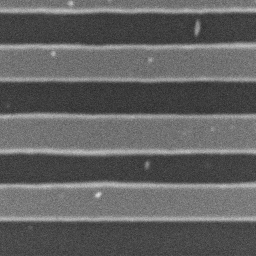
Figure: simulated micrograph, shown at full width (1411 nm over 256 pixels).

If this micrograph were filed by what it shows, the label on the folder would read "lines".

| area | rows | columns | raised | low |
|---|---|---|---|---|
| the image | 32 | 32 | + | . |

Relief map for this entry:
++++++++++++++++++++++++++++++++
................................
................................
................................
................................
................................
++++++++++++++++++++++++++++++++
++++++++++++++++++++++++++++++++
++++++++++++++++++++++++++++++++
++++++++++++++++++++++++++++++++
................................
................................
................................
................................
++++++++++++++++++++++++++++++++
++++++++++++++++++++++++++++++++
++++++++++++++++++++++++++++++++
++++++++++++++++++++++++++++++++
++++++++++++++++++++++++++++++++
................................
................................
................................
................................
++++++++++++++++++++++++++++++++
++++++++++++++++++++++++++++++++
++++++++++++++++++++++++++++++++
++++++++++++++++++++++++++++++++
........+++++..++..............+
................................
................................
................................
................................